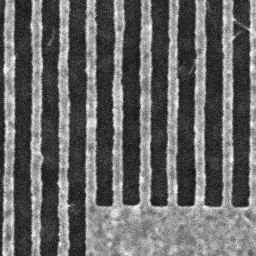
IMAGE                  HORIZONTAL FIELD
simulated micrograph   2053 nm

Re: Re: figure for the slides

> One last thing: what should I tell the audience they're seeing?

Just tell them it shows parallel lines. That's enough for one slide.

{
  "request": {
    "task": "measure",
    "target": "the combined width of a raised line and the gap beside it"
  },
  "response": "0.22 um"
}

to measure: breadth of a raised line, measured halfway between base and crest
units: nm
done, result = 70.2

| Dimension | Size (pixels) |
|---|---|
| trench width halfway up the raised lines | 18.6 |